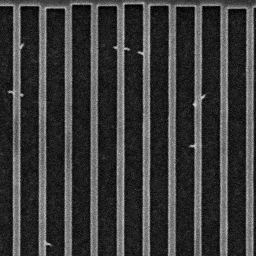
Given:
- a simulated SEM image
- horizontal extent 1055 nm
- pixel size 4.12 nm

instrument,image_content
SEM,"parallel lines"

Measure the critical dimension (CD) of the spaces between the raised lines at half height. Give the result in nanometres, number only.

81.8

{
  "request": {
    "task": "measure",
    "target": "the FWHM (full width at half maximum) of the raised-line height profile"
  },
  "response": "0.0273 µm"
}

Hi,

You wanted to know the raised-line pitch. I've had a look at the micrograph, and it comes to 0.107 um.